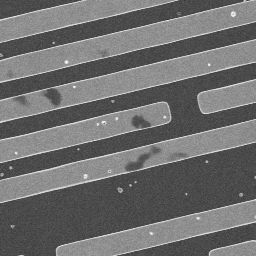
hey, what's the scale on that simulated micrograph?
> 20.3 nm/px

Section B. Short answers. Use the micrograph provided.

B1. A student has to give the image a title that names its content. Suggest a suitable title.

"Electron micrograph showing groups of lines, slits or small figures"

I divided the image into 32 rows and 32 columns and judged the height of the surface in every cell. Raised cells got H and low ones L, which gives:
LLLLLLLLHHHHHHHHHHHHLLLLLLLLLHHH
LLLLHHHHHHHHHHHHLLLLLLLLLHHHHHHH
HHHHHHHHHHHHLLLLLLLLLHHHHHHHHHHH
HHHHHHHHLLLLLLLLLHHHHHHHHHHHHLLL
HHHHLLLLLLLLLHHHHHHHHHHHHLLLLLLL
LLLLLLLLHHHHHHHHHHHHHLLLLLLLLHHH
LLLLHHHHHHHHHHHHLLLLLLLLLHHHHHHH
HHHHHHHHHHHHLLLLLLLLLHHHHHHHHHHH
HHHHHHHHLLLLLLLLLHHHHHHHHHHHHLLL
HHHHLLLLLLLLLHHHHHHHHHHHHLLLLLLL
LLLLLLLLHHHHHHHHHHHHHLLLLLLLLLHH
LLLLHHHHHHHHHHHHLLLLLLLLLHHHHHHH
HHHHHHHHHHHHLLLLLLLLLLLLLHHHHHHH
HHHHHHHHLLLLLLLLLHHHHLLLLHHHHLLL
HHHHLLLLLLLLLHHHHHHHHLLLLLLLLLLL
LLLLLLLLLHHHHHHHHHHHHLLLLLLLLLHH
LLLLLHHHHHHHHHHHLLLLLLLLLHHHHHHH
HHHHHHHHHHHHLLLLLLLLLHHHHHHHHHHH
HHHHHHHHLLLLLLLLLHHHHHHHHHHHHLLL
HHHHLLLLLLLLLHHHHHHHHHHHHLLLLLLL
LLLLLLLLLHHHHHHHHHHHHLLLLLLLLLLL
LLLLLHHHHHHHHHHHLLLLLLLLLLLLLLLL
HHHHHHHHHHHHLLLLLLLLLLLLLLLLLLLL
HHHHHHHHLLLLLLLLLLLLLLLLLLLLLLLL
HHHHLLLLLLLLLLLLLLLLLLLLLLLLLLLL
LLLLLLLLLLLLLLLLLLLLLLLLLLLLLLHH
LLLLLLLLLLLLLLLLLLLLLLLLLHHHHHHH
LLLLLLLLLLLLLLLLLLLLLHHHHHHHHHHH
LLLLLLLLLLLLLLLLLHHHHHHHHHHHHLLL
LLLLLLLLLLLLLHHHHHHHHHHHHLLLLLLL
LLLLLLLLHHHHHHHHHHHHHLLLLLLLLLHH
LLLLLLLHHHHHHHHHLLLLLLLLLLHHHHHH